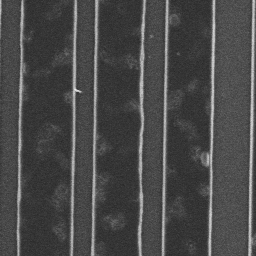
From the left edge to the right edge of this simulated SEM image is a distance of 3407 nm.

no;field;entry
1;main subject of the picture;one or a few lines or trenches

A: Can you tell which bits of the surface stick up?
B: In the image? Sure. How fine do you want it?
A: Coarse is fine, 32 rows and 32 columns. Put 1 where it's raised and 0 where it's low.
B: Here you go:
00011111100011111100011111100000
00011111100011111100011111100000
00011111100011111100011111100000
00011111100011111100011111100000
00011111100011111100011111100000
00011111100011111100011111100000
00011111100011111100011111100000
00011111100011111100011111100000
00011111100011111100011111100000
00011111100011111100011111100000
00011111100011111100011111100000
00011111100011111100011111100000
00011111100011111100011111000001
00011111100011111100011111100001
00011111100011111100011111000001
00111111100011111100011111100001
00111111100011111100011111000001
00111111100011111100011111100001
00111111100011111100011111000001
00111111100011111100011111000001
00111111100011111100011111000001
00111111100011111100011111000001
00111111100011111100011111000001
00111111100011111100011111000001
00111111100011111100011111000001
00111111100011111100111111000001
00111111100011111100111111000001
00111111100011111100111111000001
00111111100011111000111111000001
00111111100011111000111111000001
00111111100011111000111111000001
00111111100011111000111111000001